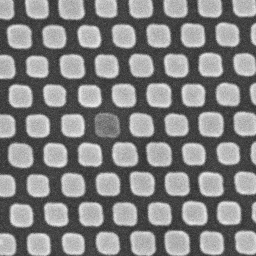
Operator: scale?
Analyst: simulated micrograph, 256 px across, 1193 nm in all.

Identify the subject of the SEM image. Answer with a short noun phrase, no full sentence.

a regular array of raised bodies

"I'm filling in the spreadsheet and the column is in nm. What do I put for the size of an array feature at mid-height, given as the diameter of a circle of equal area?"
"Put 111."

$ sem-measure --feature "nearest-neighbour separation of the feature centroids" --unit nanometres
159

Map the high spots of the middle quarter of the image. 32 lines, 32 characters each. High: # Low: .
#####...#####....#####...######.
#####...#####....#####...######.
#####...#####....#####....#####.
................................
................................
.....###.....####....#####....##
....#####...######...#####....##
....#####...######...######...##
....#####....#####...######...##
....#####....#####...######...##
......##................##......
................................
..................#.............
#####............#####...#####..
#####............#####...######.
#####............#####....#####.
#####............#####....#####.
#####............#####....####..
................................
................................
....####....#####....#####....##
#...#####...######...######...##
#...#####...######...######...##
#...#####...######...######...##
#...#####....#####...######...##
................................
................................
.........####....####.....####..
#####...#####....#####...######.
#####...######...#####...######.
#####...######...#####....#####.
#####...######...#####....#####.